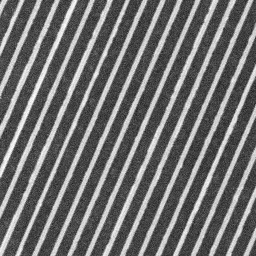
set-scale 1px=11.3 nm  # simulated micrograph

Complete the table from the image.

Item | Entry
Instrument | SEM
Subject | parallel lines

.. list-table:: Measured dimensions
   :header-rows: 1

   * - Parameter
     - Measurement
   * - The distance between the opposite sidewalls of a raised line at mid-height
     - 3.9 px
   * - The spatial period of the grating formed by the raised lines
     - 182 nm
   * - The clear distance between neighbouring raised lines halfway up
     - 142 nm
